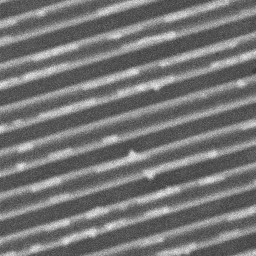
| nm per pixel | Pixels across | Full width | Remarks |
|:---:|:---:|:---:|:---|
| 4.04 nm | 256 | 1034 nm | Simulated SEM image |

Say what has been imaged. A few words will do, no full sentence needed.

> parallel lines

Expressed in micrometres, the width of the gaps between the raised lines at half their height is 0.0799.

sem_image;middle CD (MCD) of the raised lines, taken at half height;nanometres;87.6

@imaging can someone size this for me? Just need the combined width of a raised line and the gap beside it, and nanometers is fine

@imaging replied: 168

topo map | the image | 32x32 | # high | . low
........#########..........#####
.....#########.........########.
.#########..........########....
######..........#########.......
###..........#########.........#
.........#########..........####
......#########..........#######
...########..........#########..
########..........#########.....
#####.........#########.........
#..........##########........###
........########..........######
....#########..........########.
.#########.........#########....
######..........#########.......
###.........#########..........#
.........#########.........#####
......#########.........########
..#########..........########...
########........###########.....
####..........#########.........
#.........##########.........###
......##########.........#######
....########.........##########.
#########..........########.....
######..........########........
##.........##########..........#
........#########..........#####
.....#########..........########
..########..........#########...
#######..........#########......
####..........##########........